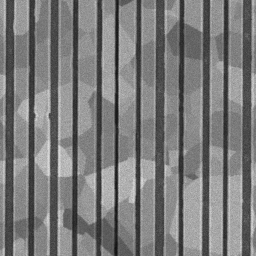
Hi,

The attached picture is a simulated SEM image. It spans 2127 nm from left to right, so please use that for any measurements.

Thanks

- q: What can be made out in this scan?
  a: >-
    parallel lines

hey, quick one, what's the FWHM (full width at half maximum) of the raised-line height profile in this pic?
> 114 nanometres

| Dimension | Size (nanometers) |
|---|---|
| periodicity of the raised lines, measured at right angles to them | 178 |